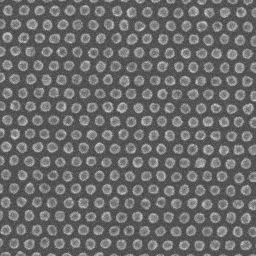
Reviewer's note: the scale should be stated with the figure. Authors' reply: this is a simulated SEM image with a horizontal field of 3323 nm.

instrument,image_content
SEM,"a regular array of raised bodies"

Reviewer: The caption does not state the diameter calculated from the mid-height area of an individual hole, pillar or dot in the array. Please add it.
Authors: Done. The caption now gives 126 nm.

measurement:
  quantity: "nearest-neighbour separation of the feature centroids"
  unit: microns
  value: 0.194